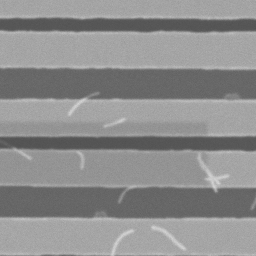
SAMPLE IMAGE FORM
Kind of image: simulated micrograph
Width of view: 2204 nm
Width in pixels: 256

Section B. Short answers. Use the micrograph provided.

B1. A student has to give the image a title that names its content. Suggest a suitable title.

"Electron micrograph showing lines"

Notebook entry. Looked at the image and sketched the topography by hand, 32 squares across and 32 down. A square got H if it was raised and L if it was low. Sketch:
HHHHHHHHHHHHHHHHHHHHHHHHHHHHHHHH
HHHHHHHHHHHHHHHHHHHHHHHHHHHHHHHH
LLLLLLLLLLLLLLLLLLLLLLLLLLLLLLLL
LLLLLLLLLLLLLLLLLLLLLLLLLLLLLLLL
HHHHHHHHHHHHHHHHHHHHHHHHHHHHHHHH
HHHHHHHHHHHHHHHHHHHHHHHHHHHHHHHH
HHHHHHHHHHHHHHHHHHHHHHHHHHHHHHHH
HHHHHHHHHHHHHHHHHHHHHHHHHHHHHHHH
HLLLHLHLHHHHHHHHHHHHHHHHHHHHHHHH
LLLLLLLLLLLLLLLLLLLLLLLLLLLLLLLL
LLLLLLLLLLLLLLLLLLLLLLLLLLLLLLLL
LLLLLLLLLLLLLLLLLLLLLLLLLLLLLLLL
LLHHHHHLHLHLLLHLLLLLLLLLLLLLLLLL
HHHHHHHHHHHHHHHHHHHHHHHHHHHHHHHH
HHHHHHHHHHHHHHHHHHHHHHHHHHHHHHHH
HHHHHHHHHHHHHHHHHHHHHHHHHHHHHHHH
HHHHHHHHHHHHHHHHHHHHHHHHHHHHHHHH
LLLLLLLLLLLLLLLLLLLLLLLLLLLLLLLL
LLLLLLLLLLLLLLLLLLLLLLLLLLLLLLLL
HHHHHHHHHHHHHHHHHHHHHHHHHHHHHHHH
HHHHHHHHHHHHHHHHHHHHHHHHHHHHHHHH
HHHHHHHHHHHHHHHHHHHHHHHHHHHHHHHH
HHHHHHHHHHHHHHHHHHHHHHHHHHHHHHHH
LLLLLLLLLLLLLLLLLLLLLLLLLLHHLLLL
LLLLLLLLLLLLLLLLLLLLLLLLLLLLLLLL
LLLLLLLLLLLLLLLLLLLLLLLLLLLLLLLL
LLLLLLLLLLLLLLLLLLLLLLLLLLLLLLLL
HHHHHHHHHHHHHHHHHHHHHHHHHHHHHHHH
HHHHHHHHHHHHHHHHHHHHHHHHHHHHHHHH
HHHHHHHHHHHHHHHHHHHHHHHHHHHHHHHH
HHHHHHHHHHHHHHHHHHHHHHHHHHHHHHHH
HHHHHHHHHHHHHHHHHHHHHHHHHHHHHHHH